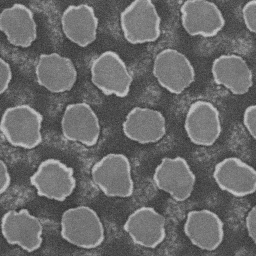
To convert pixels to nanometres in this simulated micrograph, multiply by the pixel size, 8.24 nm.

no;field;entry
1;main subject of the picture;a regular array of raised bodies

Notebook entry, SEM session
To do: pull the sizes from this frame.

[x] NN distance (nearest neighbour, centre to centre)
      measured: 0.473 microns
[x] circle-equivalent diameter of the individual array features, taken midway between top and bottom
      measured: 317 nanometers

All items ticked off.